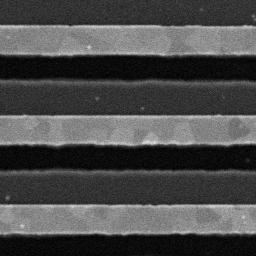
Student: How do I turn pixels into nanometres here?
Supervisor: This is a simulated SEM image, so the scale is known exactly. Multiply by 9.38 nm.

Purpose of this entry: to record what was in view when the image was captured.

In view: lines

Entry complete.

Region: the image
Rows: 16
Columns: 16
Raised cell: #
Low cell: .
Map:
################
################
################
................
................
################
################
################
################
................
................
################
################
################
################
................